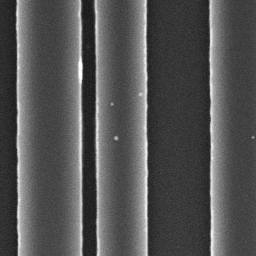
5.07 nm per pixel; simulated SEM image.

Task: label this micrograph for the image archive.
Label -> lines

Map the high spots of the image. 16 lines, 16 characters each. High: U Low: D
DUUUUUUUUDDDDUUU
DUUUUUUUUDDDDUUU
DUUUUUUUUDDDDUUU
DUUUUUUUUDDDDUUU
DUUUUUUUUDDDDUUU
DUUUUUUUUDDDDUUU
DUUUUUUUUDDDDUUU
DUUUUUUUUDDDDUUU
DUUUUUUUUDDDDUUU
DUUUUUUUUDDDDUUU
DUUUUUUUUDDDDUUU
DUUUUUUUUDDDDUUU
DUUUUUUUUDDDDUUU
DUUUUUUUUDDDDUUU
DUUUUUUUUDDDDUUU
DUUUUUUUUDDDDUUU